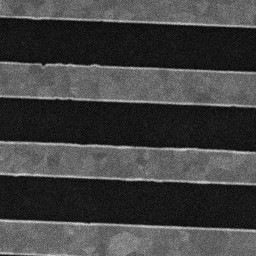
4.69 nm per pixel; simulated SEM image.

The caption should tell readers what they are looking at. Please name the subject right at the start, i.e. one or a few lines or trenches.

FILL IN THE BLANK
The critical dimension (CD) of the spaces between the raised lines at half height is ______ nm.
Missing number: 214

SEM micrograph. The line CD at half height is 157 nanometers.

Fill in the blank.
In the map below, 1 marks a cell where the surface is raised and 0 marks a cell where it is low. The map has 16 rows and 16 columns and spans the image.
1111111111111111
0000000000001111
0000000000000000
0000000000000000
1111111111111110
1111111111111111
0000000000001111
0000000000000000
0000000000000000
1111111111111110
1111111111111111
0000000000000001
0000000000000000
0000000000000000
1111111111111111
1111111111111111